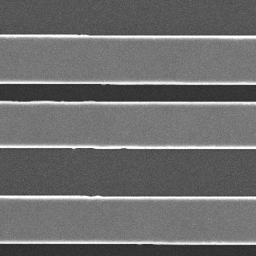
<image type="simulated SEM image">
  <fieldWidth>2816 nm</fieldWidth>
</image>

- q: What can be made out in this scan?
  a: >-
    lines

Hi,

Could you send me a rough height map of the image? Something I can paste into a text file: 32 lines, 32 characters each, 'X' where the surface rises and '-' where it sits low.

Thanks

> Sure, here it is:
--------------------------------
--------------------------------
--------------------------------
--------------------------------
XXXXXXXXX-----------------------
XXXXXXXXXXXXXXXXXXXXXXXXXXXXXXXX
XXXXXXXXXXXXXXXXXXXXXXXXXXXXXXXX
XXXXXXXXXXXXXXXXXXXXXXXXXXXXXXXX
XXXXXXXXXXXXXXXXXXXXXXXXXXXXXXXX
XXXXXXXXXXXXXXXXXXXXXXXXXXXXXXXX
--------------XXXXXXXXXXXXXXXXXX
--------------------------------
--------------------------------
XXXXXXXXXXXXXXXXXXXXXXXXXXXXXXXX
XXXXXXXXXXXXXXXXXXXXXXXXXXXXXXXX
XXXXXXXXXXXXXXXXXXXXXXXXXXXXXXXX
XXXXXXXXXXXXXXXXXXXXXXXXXXXXXXXX
XXXXXXXXXXXXXXXXXXXXXXXXXXXXXXXX
------------XXX-XXXXXXXXXXXXXXXX
--------------------------------
--------------------------------
--------------------------------
--------------------------------
--------------------------------
--------------------------------
XXXXXXXXXXXXXXXXXXXXXXXXXXXXXXXX
XXXXXXXXXXXXXXXXXXXXXXXXXXXXXXXX
XXXXXXXXXXXXXXXXXXXXXXXXXXXXXXXX
XXXXXXXXXXXXXXXXXXXXXXXXXXXXXXXX
XXXXXXXXXXXXXXXXXXXXXXXXXXXXXXXX
---------------------XXXXXXXXXXX
--------------------------------